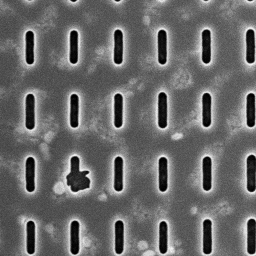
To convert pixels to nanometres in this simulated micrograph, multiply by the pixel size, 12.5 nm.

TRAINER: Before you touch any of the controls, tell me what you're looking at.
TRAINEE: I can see a regular array of holes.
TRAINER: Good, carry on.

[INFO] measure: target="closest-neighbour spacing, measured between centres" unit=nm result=551